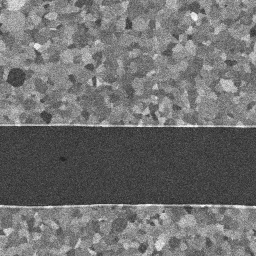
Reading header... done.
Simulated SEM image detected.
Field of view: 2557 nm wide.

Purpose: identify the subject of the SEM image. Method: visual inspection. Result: one or a few lines or trenches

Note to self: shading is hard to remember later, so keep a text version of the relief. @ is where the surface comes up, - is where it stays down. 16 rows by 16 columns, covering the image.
@@@@@@@@@@@@@@@@
@@@@@@@@@@@@@@@@
@@@@@@@@@@@@@@@@
@@@@@@@@@@@@@@@@
@@@@@@@@@@@@@@@@
@@@@@@@@@@@@@@@@
@@@@@@@@@@@@@@@@
@@@@@@@@@@@@@@@@
----------------
----------------
----------------
----------------
----------------
@@@@@@@@@@@@@@@@
@@@@@@@@@@@@@@@@
@@@@@@@@@@@@@@@@